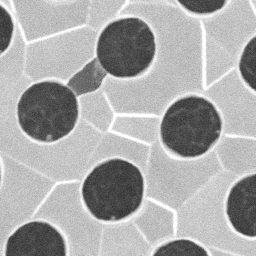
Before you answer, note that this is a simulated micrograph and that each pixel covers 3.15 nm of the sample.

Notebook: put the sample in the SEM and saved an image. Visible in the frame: holes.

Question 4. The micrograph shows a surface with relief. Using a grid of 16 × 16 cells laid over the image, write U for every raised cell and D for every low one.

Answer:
UUUUUUUUUUUUDDUU
DUUUUUUDDUUUUUUU
DUUUUUDDDDUUUUUU
UUUUUUDDDDUUUUUD
UUUUUDDDDUUUUUUD
UUDDDDUUUUUUUUUU
UDDDDUUUUUUDDUUU
UDDDDUUUUUDDDDUU
UUDDUUUUUUDDDDUU
UUUUUUUUUUUDDUUU
UUUUUUDDDUUUUUUU
UUUUUDDDDUUUUUUD
UUUUUDDDDUUUUUDD
UUUUUUDDUUUUUUDD
UDDDUUUUUUUUUUUD
DDDDUUUUUUDDDUUU